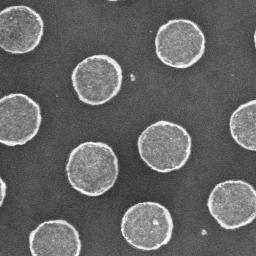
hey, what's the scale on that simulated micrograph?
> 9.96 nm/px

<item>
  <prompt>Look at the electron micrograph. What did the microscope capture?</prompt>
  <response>raised bodies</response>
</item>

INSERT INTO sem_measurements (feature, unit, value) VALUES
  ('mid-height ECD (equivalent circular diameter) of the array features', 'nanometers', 482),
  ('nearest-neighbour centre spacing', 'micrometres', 0.784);